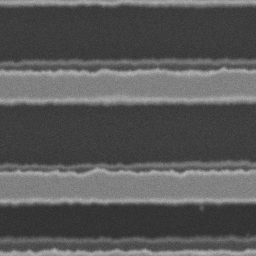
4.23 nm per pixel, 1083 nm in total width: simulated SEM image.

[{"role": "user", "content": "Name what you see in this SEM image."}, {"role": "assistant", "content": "lines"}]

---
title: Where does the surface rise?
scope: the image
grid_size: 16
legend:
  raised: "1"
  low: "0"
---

0000000000000000
0000000000000000
0000000000000000
0000000000000000
1111111111111111
1111111111111111
0000000000000000
0000000000000000
0000000000000000
0000000000000000
1111111111111111
1111111111111111
1111111111111111
0000000000000000
0000000000000000
1111111111111111